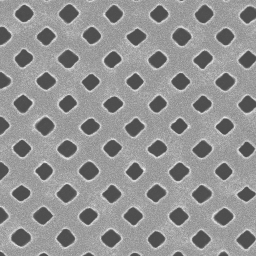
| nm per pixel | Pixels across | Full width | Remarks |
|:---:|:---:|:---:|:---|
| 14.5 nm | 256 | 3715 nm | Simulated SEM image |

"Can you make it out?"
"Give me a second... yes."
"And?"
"a regular array of holes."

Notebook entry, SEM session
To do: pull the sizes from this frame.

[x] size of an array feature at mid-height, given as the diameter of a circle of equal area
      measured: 234 nanometers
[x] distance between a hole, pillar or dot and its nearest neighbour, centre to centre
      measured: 0.453 micrometres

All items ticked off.